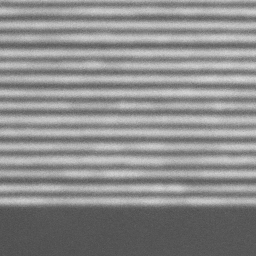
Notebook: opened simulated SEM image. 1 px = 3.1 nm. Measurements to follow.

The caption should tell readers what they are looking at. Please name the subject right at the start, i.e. parallel lines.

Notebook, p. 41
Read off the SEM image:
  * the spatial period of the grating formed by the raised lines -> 42.1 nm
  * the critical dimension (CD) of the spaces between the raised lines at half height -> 24.8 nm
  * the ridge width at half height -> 0.0163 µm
